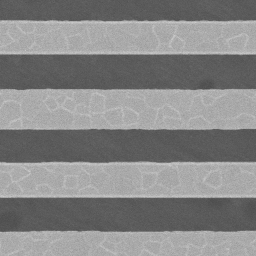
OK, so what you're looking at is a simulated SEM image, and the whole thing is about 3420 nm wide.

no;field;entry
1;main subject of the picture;lines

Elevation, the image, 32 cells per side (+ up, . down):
................................
................................
................................
++++++++++++++++++++++++++++++++
++++++++++++++++++++++++++++++++
++++++++++++++++++++++++++++++++
++++++++++++++++++++++++++++++++
................................
................................
................................
................................
++++++++++++++++++++++++++++++++
++++++++++++++++++++++++++++++++
++++++++++++++++++++++++++++++++
++++++++++++++++++++++++++++++++
++++++++++++++++++++++++++++++++
................................
................................
................................
................................
++++++++++++++++++++++++++++++++
++++++++++++++++++++++++++++++++
++++++++++++++++++++++++++++++++
++++++++++++++++++++++++++++++++
++++++++++++++++++++++++++++++++
................................
................................
................................
................................
++++++++++++++++++++++++++++++++
++++++++++++++++++++++++++++++++
++++++++++++++++++++++++++++++++